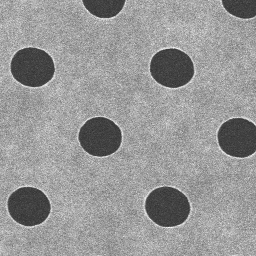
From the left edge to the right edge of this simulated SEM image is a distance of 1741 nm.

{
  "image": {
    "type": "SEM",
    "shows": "holes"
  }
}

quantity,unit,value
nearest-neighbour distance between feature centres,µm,0.66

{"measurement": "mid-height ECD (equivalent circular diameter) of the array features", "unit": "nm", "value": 284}